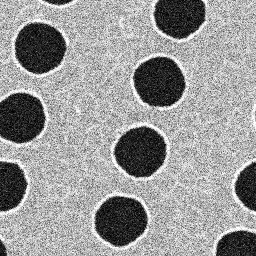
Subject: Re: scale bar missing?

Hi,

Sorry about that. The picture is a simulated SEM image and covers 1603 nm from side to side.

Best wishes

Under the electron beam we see holes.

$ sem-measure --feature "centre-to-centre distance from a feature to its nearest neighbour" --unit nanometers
451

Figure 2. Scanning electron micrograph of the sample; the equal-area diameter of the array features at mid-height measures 322 nm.